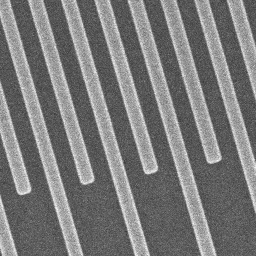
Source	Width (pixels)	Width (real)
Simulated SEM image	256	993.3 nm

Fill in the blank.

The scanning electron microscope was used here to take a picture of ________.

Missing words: parallel lines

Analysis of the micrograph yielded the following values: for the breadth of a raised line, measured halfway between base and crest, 53.5 nanometres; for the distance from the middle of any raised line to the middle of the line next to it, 124 nanometres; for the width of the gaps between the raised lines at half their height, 68.9 nanometres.